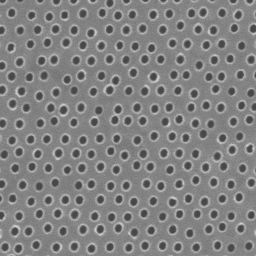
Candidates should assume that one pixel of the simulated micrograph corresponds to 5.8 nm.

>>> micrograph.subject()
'a regular array of holes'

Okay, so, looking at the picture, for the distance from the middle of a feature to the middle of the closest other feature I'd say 87.8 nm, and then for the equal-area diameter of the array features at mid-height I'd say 44.8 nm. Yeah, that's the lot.